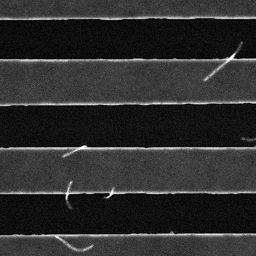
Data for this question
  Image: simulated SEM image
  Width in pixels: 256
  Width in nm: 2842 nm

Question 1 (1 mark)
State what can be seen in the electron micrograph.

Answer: lines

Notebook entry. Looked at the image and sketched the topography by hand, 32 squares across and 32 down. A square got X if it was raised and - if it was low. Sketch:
XXXXXXXXXXXXXXXXXXXXXXXXXXXXXXXX
XXXXXXXXXXXXXXXXXXXXXXXXXXXXXXXX
--------------------------------
--------------------------------
--------------------------------
--------------------------------
--------------------------------
XXXXXXXXXXXXXXXXXXXXXXXXXXXXXXXX
XXXXXXXXXXXXXXXXXXXXXXXXXXXXXXXX
XXXXXXXXXXXXXXXXXXXXXXXXXXXXXXXX
XXXXXXXXXXXXXXXXXXXXXXXXXXXXXXXX
XXXXXXXXXXXXXXXXXXXXXXXXXXXXXXXX
XXXXXXXXXXXXXXXXXXXXXXXXXXXXXXXX
--------------------------------
--------------------------------
--------------------------------
--------------------------------
--------------------------------
XXXXXXXXXXXXXXXXXXXXXXXXXXXXXXXX
XXXXXXXXXXXXXXXXXXXXXXXXXXXXXXXX
XXXXXXXXXXXXXXXXXXXXXXXXXXXXXXXX
XXXXXXXXXXXXXXXXXXXXXXXXXXXXXXXX
XXXXXXXXXXXXXXXXXXXXXXXXXXXXXXXX
XXXXXXXXXXXXXXXXXXXXXXXXXXXXXXXX
--------------------------------
--------------------------------
--------------------------------
--------------------------------
--------------------------------
XXXXXXXXXXXXXXXXXXXXXXXXXXXXXXXX
XXXXXXXXXXXXXXXXXXXXXXXXXXXXXXXX
XXXXXXXXXXXXXXXXXXXXXXXXXXXXXXXX